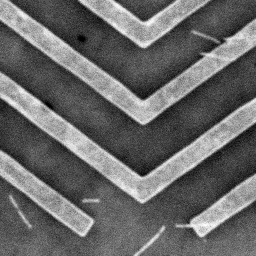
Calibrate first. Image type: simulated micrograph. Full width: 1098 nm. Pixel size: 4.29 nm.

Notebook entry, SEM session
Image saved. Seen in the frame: groups of lines, slits or small figures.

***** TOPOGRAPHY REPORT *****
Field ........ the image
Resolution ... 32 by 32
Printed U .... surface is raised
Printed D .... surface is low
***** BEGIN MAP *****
UUDDDDDDDDUUUUUDDDDDDDUUUDDDDDDD
UUUDDDDDDDDDUUUUDDDDUUUUDDDDDDDD
UUUUDDDDDDDDDUUUUDDUUUUDDDDDDDDD
DDUUUUDDDDDDDDDUUUUUUDDDDDDDDDDU
DDDUUUUDDDDDDDDDUUUUDDDDDDDDDUUU
DDDDUUUUDDDDDDDDDUUDDDDDDDDDUUUU
DDDDDDUUUDDDDDDDDDDDDDDDDDUUUUUD
DDDDDDDUUUUDDDDDDDDDDDDDDUUUUDDD
DDDDDDDDUUUUDDDDDDDDDDDDUUUUDDDD
UDDDDDDDDDUUUUDDDDDDDDUUUUDDDDDD
UUDDDDDDDDDUUUUDDDDDDUUUUDDDDDDD
UUUDDDDDDDDDUUUUDDDDUUUUDDDDDDDD
DUUUUDDDDDDDDDUUUUUUUUDDDDDDDDDD
DDUUUUDDDDDDDDDUUUUUUDDDDDDDDDUU
DDDUUUUDDDDDDDDDUUUDDDDDDDDDDUUU
DDDDDUUUUDDDDDDDDDDDDDDDDDDUUUUU
DDDDDDUUUUDDDDDDDDDDDDDDDDUUUUDD
DDDDDDDUUUUDDDDDDDDDDDDDDUUUUDDD
DDDDDDDDDUUUUDDDDDDDDDDUUUUDDDDD
UDDDDDDDDDUUUUDDDDDDDDUUUUDDDDDD
UUDDDDDDDDDUUUUDDDDDDUUUUDDDDDDD
UUUUDDDDDDDDDUUUUDDUUUUDDDDDDDDD
DUUUUDDDDDDDDDUUUUUUUUDDDDDDDDDU
DDUUUUDDDDDDDDDUUUUUDDDDDDDDDUUU
DDDDUUUUDDDDDDDDDUUDDDDDDDDDUUUU
DDDDDUUUUDDDDDDDDDDDDDDDDDDUUUUD
DDDDDDUUUUDDDDDDDDDDDDDDDDUUUUDD
DDDDDDDDUUUDDDDDDDDDDDDDUUUUDDDD
DDDDDDDDDUUDDDDDDDDDDDDDUUUDDDDD
DDDDDDDDDDDDDDDDDDDDDDDDDDDDDDDD
DDDDDDDDDDDDDDDDDDDDDDDDDDDDDDDD
DDDDDDDDDDDDDDDDDDDDDDDDDDDDDDDD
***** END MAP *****